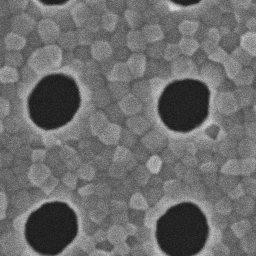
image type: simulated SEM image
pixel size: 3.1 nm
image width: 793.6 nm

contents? holes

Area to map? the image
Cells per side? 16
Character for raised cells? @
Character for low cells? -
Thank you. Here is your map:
@@@@@@@@@@@@@@@@
@@@@@@@@@@@@@@@@
@@@@@@@@@@@@@@@@
@@@@@@@@@@@@@@@@
@@@@@@@@@@@@@@@@
@@---@@@@@---@@@
@@---@@@@@---@@@
@@--@@@@@@---@@@
@@@@@@@@@@@@@@@@
@@@@@@@@@@@@@@@@
@@@@@@@@@@@@@@@@
@@@@@@@@@@@@@@@@
@@@@@@@@@@@@@@@@
@@---@@@@@---@@@
@@---@@@@@---@@@
@@--@@@@@@---@@@